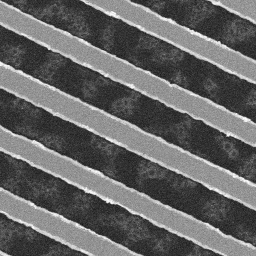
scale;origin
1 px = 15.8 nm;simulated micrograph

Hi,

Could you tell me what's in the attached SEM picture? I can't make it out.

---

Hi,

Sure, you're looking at parallel lines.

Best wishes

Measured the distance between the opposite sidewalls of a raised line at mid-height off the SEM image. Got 345 nanometres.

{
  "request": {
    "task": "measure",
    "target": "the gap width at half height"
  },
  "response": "0.545 um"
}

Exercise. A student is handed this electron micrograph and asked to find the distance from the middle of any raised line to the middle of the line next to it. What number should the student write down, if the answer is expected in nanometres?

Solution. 891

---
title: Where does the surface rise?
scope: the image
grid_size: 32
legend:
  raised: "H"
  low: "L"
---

HLLLLLLLLLLHHHHHHLLLLLLLLLLHHHHH
HHHLLLLLLLLLLHHHHHHLLLLLLLLLLHHH
HHHHHLLLLLLLLLLHHHHHHLLLLLLLLLLH
LHHHHHHLLLLLLLLLLHHHHHHLLLLLLLLL
LLLHHHHHHLLLLLLLLLLLHHHHHHLLLLLL
LLLLLHHHHHHLLLLLLLLLLLHHHHHHLLLL
LLLLLLLHHHHHHLLLLLLLLLLHHHHHHHLL
LLLLLLLLLHHHHHHLLLLLLLLLLLHHHHHH
HHLLLLLLLLLHHHHHHLLLLLLLLLLLHHHH
HHHHLLLLLLLLLHHHHHHLLLLLLLLLLLHH
HHHHHHLLLLLLLLLHHHHHHLLLLLLLLLLL
LHHHHHHHLLLLLLLLLLHHHHHHLLLLLLLL
LLLHHHHHHHLLLLLLLLLLHHHHHHLLLLLL
LLLLLHHHHHHHLLLLLLLLLLHHHHHHLLLL
LLLLLLLHHHHHHHLLLLLLLLLLHHHHHHLL
LLLLLLLLLLHHHHHHLLLLLLLLLLHHHHHH
HLLLLLLLLLLLHHHHHHLLLLLLLLLLHHHH
HHHHLLLLLLLLLHHHHHHHLLLLLLLLLLHH
HHHHHHLLLLLLLLLLHHHHHHLLLLLLLLLL
LLHHHHHHLLLLLLLLLLHHHHHHLLLLLLLL
LLLLHHHHHHLLLLLLLLLLHHHHHHLLLLLL
LLLLLLHHHHHHLLLLLLLLLLHHHHHHHLLL
LLLLLLLLHHHHHHLLLLLLLLLLHHHHHHHL
LLLLLLLLLLHHHHHHLLLLLLLLLLHHHHHH
HHLLLLLLLLLLHHHHHHLLLLLLLLLLHHHH
HHHHLLLLLLLLLLHHHHHHLLLLLLLLLLHH
HHHHHHLLLLLLLLLLHHHHHHHLLLLLLLLL
LLHHHHHHLLLLLLLLLLHHHHHHHLLLLLLL
LLLLHHHHHHHLLLLLLLLLHHHHHHHLLLLL
LLLLLLHHHHHHHLLLLLLLLLLHHHHHLLLL
LLLLLLLLHHHHHHHLLLLLLLLLLHHHHHHL
LLLLLLLLLLHHHHHHHLLLLLLLLLLHHHHH